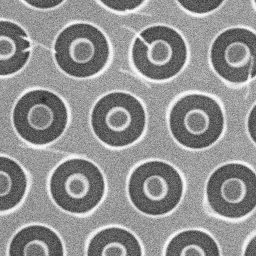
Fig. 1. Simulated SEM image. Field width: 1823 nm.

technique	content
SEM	an array of small figures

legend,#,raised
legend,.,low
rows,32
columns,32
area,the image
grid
###.....#####.....####......####
###############.########..######
################################
...#####....######...########..#
...####......####......####.....
##..###..##...###..##..####..#..
##..###..###..##...##..###..###.
...####..##...##...##..###..###.
...#####.....####......####.....
.########...######....#####.....
#############################.##
###....#######.#################
##......####.....#####.....#####
##..##..####......###.......####
##..###..##...##..###..###..###.
##..##..###..###..###..###..###.
##......####......###...#...###.
###....######....#####.....#####
##############.#########..######
.###############################
..#####.....#####....#######...#
...####......###......#####.....
#...##...##..###..##...###...#..
#..###..###..###..###..###..##..
...###...#...###...#...###..##..
..#####.....#####.....####......
.########..#######...#####.....#
#############################.##
###...#######..#################
##.....####......#####....#####.
#...#...###.......###......####.
#..###..###..###..###..##..###..